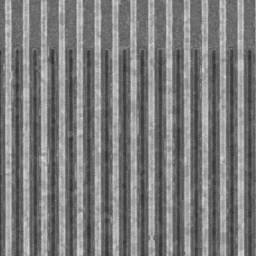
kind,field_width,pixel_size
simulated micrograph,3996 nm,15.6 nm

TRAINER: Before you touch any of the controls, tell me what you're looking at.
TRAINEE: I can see parallel lines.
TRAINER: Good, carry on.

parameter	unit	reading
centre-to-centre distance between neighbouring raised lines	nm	139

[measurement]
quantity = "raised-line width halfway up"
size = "78.1 nm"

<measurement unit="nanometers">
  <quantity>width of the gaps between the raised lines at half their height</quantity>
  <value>58.5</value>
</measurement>